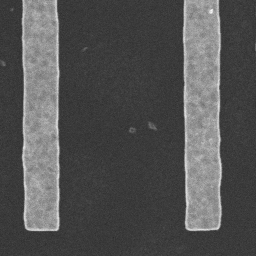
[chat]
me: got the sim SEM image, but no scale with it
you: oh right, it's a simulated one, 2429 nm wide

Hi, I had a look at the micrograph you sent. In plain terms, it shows wiring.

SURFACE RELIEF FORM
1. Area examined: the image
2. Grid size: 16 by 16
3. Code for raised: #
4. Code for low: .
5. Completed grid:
.###........##..
.###.......###..
.###.......###..
.###........##..
.###........##..
..##........##..
..##........##..
.###........##..
.###........##..
.###........##..
.###........##..
..##........##..
..##........##..
..##........##..
................
................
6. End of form